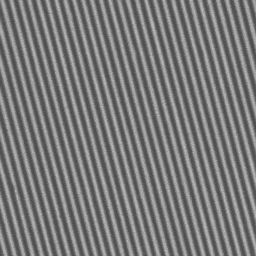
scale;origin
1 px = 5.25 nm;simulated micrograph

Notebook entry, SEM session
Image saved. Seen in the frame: parallel lines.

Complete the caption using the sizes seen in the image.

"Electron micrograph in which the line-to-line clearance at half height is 23.5 nm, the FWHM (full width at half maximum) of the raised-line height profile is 19 nm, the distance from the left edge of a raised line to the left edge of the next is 45.6 nanometres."